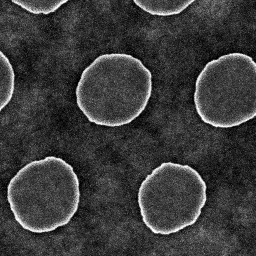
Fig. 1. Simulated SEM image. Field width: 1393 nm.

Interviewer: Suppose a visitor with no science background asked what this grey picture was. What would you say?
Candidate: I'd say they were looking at raised bodies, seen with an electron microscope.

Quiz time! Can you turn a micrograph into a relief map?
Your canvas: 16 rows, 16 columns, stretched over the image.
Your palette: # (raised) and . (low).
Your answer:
..##.....###....
................
................
......##......#.
#....####....###
#....####...####
.....####...####
......##.....##.
................
................
.###......##....
.####....####...
.####....####...
.###.....###....
..........#.....
................